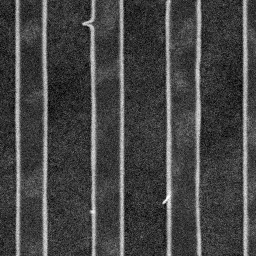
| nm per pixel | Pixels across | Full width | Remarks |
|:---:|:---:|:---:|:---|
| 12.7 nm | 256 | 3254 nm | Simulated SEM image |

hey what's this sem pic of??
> one or a few lines or trenches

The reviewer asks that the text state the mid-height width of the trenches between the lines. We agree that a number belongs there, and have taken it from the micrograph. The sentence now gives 591 nm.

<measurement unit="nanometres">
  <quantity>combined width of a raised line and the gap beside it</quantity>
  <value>964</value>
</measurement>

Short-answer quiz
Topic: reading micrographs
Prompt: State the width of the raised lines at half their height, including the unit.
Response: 0.37 µm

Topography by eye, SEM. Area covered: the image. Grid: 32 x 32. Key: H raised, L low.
LLHHHHLLLLLLHHHLLLLLLHHHHLLLLLLH
LLHHHHLLLLLLHHHLLLLLLHHHHLLLLLLH
LLHHHHLLLLLHHHHLLLLLLHHHHLLLLLLH
LLHHHHLLLLLHHHHLLLLLLHHHHLLLLLLH
LLHHHHLLLLLLHHHLLLLLLHHHHLLLLLLH
LLHHHHLLLLLLHHHLLLLLLHHHHLLLLLLH
LLHHHHLLLLLLHHHLLLLLLHHHHLLLLLLH
LLHHHHLLLLLLHHHLLLLLLHHHHLLLLLLH
LLHHHHLLLLLLHHHLLLLLLHHHHLLLLLLH
LLHHHHLLLLLLHHHLLLLLLHHHHLLLLLLH
LLHHHHLLLLLLHHHLLLLLLHHHHLLLLLLH
LLHHHHLLLLLLHHHLLLLLLHHHHLLLLLLH
LLHHHHLLLLLLHHHLLLLLLHHHHLLLLLLH
LLHHHHLLLLLLHHHLLLLLLHHHHLLLLLLH
LLHHHHLLLLLLHHHLLLLLLHHHHLLLLLLH
LLHHHHLLLLLLHHHLLLLLLHHHHLLLLLLH
LLHHHHLLLLLLHHHLLLLLLHHHHLLLLLLH
LLHHHHLLLLLLHHHLLLLLLHHHHLLLLLLH
LLHHHHLLLLLLHHHLLLLLLHHHHLLLLLLH
LLHHHHLLLLLLHHHLLLLLLHHHHLLLLLLH
LLHHHHLLLLLLHHHLLLLLLHHHHLLLLLLH
LLHHHHLLLLLLHHHLLLLLLHHHHLLLLLLH
LLHHHHLLLLLLHHHLLLLLLHHHHLLLLLLH
LLHHHHLLLLLLHHHLLLLLLHHHHLLLLLLH
LLHHHHLLLLLLHHHLLLLLLHHHHLLLLLLH
LLHHHHLLLLLLHHHLLLLLLHHHHLLLLLLH
LLHHHHLLLLLLHHHLLLLLLHHHHLLLLLLH
LLHHHHLLLLLLHHHLLLLLLHHHHLLLLLLH
LLHHHHLLLLLLHHHLLLLLLHHHHLLLLLLH
LLHHHHLLLLLLHHHLLLLLLHHHHLLLLLLH
LLHHHHLLLLLLHHHLLLLLLHHHHLLLLLLH
LLHHHHLLLLLLHHHLLLLLLHHHHLLLLLLH